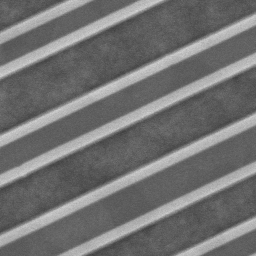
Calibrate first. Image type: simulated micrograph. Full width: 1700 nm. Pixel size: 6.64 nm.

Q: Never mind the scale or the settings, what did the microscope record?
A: one or a few lines or trenches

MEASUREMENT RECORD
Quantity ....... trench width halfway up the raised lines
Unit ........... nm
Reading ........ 354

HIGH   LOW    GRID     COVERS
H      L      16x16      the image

LLLLHHHHHLLLLLLL
LLHHHHLLLLLLLLLH
HHHHLLLLLLLLLHHH
HHLLLLLLLLLHHHHH
LLLLLLLLLHHHHHLL
LLLLLLLHHHHHLLLL
LLLLLHHHHHLLLLLL
LLLHHHHHLLLLLLLL
LHHHHHLLLLLLLLHH
HHHHLLLLLLLLHHHH
HHLLLLLLLHHHHHHH
LLLLLLLHHHHHHHLL
LLLLLHHHHHHHLLLL
LLLHHHHHHHLLLLLL
LHHHHHHHLLLLLLLH
HHHHHLLLLLLLLHHH